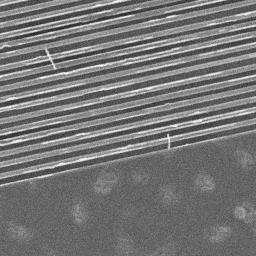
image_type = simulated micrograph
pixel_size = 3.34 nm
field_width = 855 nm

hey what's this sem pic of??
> parallel lines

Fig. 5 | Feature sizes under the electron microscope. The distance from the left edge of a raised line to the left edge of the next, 0.0353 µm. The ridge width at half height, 0.0172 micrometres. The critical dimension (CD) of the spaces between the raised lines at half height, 0.0172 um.